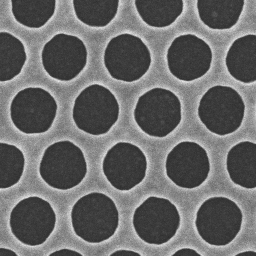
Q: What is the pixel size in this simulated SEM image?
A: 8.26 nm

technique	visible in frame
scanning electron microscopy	a regular array of holes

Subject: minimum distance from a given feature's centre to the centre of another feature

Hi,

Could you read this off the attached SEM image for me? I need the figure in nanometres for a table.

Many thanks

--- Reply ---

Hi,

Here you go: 506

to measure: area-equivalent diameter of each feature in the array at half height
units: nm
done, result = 388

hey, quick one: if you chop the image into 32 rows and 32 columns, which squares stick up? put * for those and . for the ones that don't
**.....**......**......**.....**
**.....**......**......**.....**
**....****....****....***.....**
**************************...***
..*****..******..******.*******.
...***....****....***.....***...
...**......**......**.....**....
...**......**......**.....**....
...***....***......**.....**....
..****....****....****...****...
********************************
**....****....****...*****....**
**.....**......**.....***.....**
*......**......**......**......*
*......**......**......**.....**
**....****....***.....***.....**
***..******..*****...******..***
********************************
..****....****...*****...****...
...**......**.....***.....**....
...**......**.....***.....**....
...**......**.....***.....***...
..****....****....***.....***...
.******..******.*******.*******.
***********..*******************
**....***.....****....***....***
*......**......**.....***.....**
*......**......**.....***.....**
*......**......**.....***.....**
**....****....***.....***.....**
***..**************.******..****
..*****...****...*****...******.